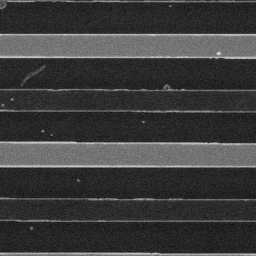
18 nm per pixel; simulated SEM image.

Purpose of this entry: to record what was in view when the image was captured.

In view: lines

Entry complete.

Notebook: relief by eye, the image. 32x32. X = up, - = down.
--------------------------------
--------------------------------
--------------------------------
--------------------------------
XXXXXXXXXXXXXXXXXXXXXXXXXXXXXXXX
XXXXXXXXXXXXXXXXXXXXXXXXXXXXXXXX
XXXXXXXXXXXXXXXXXXXXXXXXXXXXXXXX
--------------------------------
--------------------------------
--------------------------------
--------------------------------
XXXXXXXXXXXXXXXXXXXXXXXXXXXXXXXX
XXXXXXXXXXXXXXXXXXXXXXXXXXXXXXXX
XXXXXXXXXXXXXXXXXXXXXXXXXXXXXXXX
--------------------------------
--------------------------------
--------------------------------
--------------------------------
XXXXXXXXXXXXXXXXXXXXXXXXXXXXXXXX
XXXXXXXXXXXXXXXXXXXXXXXXXXXXXXXX
XXXXXXXXXXXXXXXXXXXXXXXXXXXXXXXX
--------------------------------
--------------------------------
--------------------------------
--------------------------------
XXXXXXXXXXXXXXXXXXXXXXXXXXXXXXXX
XXXXXXXXXXXXXXXXXXXXXXXXXXXXXXXX
XXXXXXXXXXXXXXXXXXXXXXXXXXXXXXXX
--------------------------------
--------------------------------
--------------------------------
--------------------------------